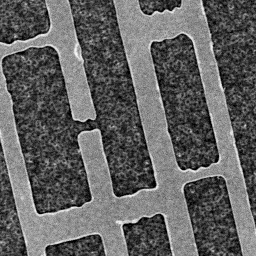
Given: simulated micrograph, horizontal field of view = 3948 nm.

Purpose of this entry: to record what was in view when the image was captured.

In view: one or a few lines or trenches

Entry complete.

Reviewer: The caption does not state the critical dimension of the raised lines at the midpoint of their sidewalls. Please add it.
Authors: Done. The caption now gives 336 nanometres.